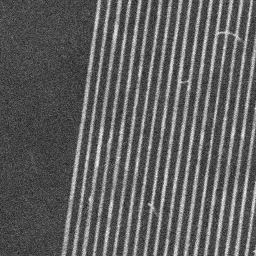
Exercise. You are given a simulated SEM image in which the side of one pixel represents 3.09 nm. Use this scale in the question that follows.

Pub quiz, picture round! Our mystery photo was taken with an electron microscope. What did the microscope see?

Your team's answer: parallel lines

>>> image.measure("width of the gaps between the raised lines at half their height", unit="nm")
22.6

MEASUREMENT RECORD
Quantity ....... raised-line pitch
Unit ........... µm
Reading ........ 0.031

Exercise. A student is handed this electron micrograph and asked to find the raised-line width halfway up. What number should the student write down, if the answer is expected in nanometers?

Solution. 7.6